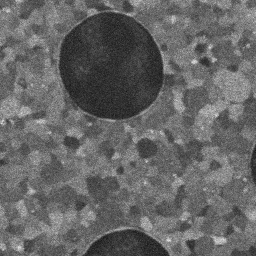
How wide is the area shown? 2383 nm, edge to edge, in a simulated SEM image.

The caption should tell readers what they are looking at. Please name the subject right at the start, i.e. holes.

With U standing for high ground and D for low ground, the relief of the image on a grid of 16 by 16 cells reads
UUUUUUUUUUUUUUUU
UUUUUDDDDUUUUUUU
UUUUDDDDDDUUUUUU
UUUUDDDDDDUUUUUU
UUUUDDDDDDUUUUUU
UUUUDDDDDDUUUUUU
UUUUUDDDDDUUUUUU
UUUUUUUUUUUUUUUU
UUUUUUUUUUUUUUUU
UUUUUUUUUUUUUUUU
UUUUUUUUUUUUUUUU
UUUUUUUUUUUUUUUU
UUUUUUUUUUUUUUUU
UUUUUUUUUUUUUUUU
UUUUUUUDDUUUUUUU
UUUUUUDDDDUUUUUU